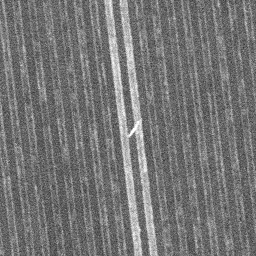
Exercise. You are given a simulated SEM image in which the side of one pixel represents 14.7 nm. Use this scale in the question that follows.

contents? parallel lines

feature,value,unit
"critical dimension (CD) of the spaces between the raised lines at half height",119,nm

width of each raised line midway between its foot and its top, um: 0.104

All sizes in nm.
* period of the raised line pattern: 225